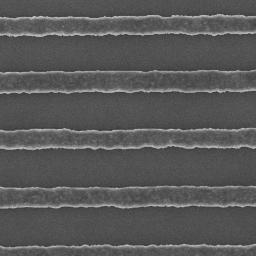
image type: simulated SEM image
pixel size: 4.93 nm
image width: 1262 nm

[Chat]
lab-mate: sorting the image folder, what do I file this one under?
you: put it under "lines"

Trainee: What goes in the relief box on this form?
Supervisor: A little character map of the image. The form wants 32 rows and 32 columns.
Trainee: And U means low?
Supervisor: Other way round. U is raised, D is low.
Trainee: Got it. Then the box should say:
DDDDDDDDDDDDDDDDDDDDDDDDDDDDDDDD
DDDDDDDDDDDDDDDDDDDDDDDDDDDDDDDD
UUUUUUUUUUUUUUUUUUUUUUUUUUUUUUUU
UUUUUUUUUUUUUUUUUUUUUUUUUUUUUUUU
DDDDDDDDDDDDDDDDDDDDDDDDDDDDDDDD
DDDDDDDDDDDDDDDDDDDDDDDDDDDDDDDD
DDDDDDDDDDDDDDDDDDDDDDDDDDDDDDDD
DDDDDDDDDDDDDDDDDDDDDDDDDDDDDDDD
DDDDDDDDDDDDDDDDDDDDDDDDDDDDDDDD
UUUUUUUUUUUUUUUUUUUUUUUUUUUUUUUU
UUUUUUUUUUUUUUUUUUUUUUUUUUUUUUUU
UUUUUUUUUUUDDUUUUDUDUDDUUDUUDDDD
DDDDDDDDDDDDDDDDDDDDDDDDDDDDDDDD
DDDDDDDDDDDDDDDDDDDDDDDDDDDDDDDD
DDDDDDDDDDDDDDDDDDDDDDDDDDDDDDDD
DDDDDDDDDDDDDDDDDDDDDDDDDDDDDDDD
UUUUUUUUUUUUUUUUUUUUUUUUUUUUUUUU
UUUUUUUUUUUUUUUUUUUUUUUUUUUUUUUU
UUUUUUUUUUUUUUUUUUDUDDDUDDDUUUDU
DDDDDDDDDDDDDDDDDDDDDDDDDDDDDDDD
DDDDDDDDDDDDDDDDDDDDDDDDDDDDDDDD
DDDDDDDDDDDDDDDDDDDDDDDDDDDDDDDD
DDDDDDDDDDDDDDDDDDDDDDDDDDDDDDDD
UDDDUDDUUDDUUDDDUUUUUUUUUUUUUUUU
UUUUUUUUUUUUUUUUUUUUUUUUUUUUUUUU
UUUUUUUUUUUUUUUUUUUUUUUUUUUUUUUU
DDDDDDDDDDDDDDDDDDDDDDDDDDDDDDDD
DDDDDDDDDDDDDDDDDDDDDDDDDDDDDDDD
DDDDDDDDDDDDDDDDDDDDDDDDDDDDDDDD
DDDDDDDDDDDDDDDDDDDDDDDDDDDDDDDD
DDDDDDDDDDDDDDDDDDDDDDDDDDDDDDDD
UUUUUUUUUUUUUUUUUUUUUUUUUUUUUUUU